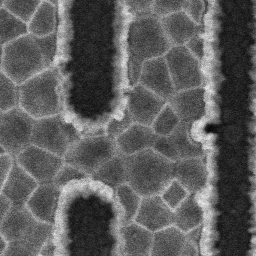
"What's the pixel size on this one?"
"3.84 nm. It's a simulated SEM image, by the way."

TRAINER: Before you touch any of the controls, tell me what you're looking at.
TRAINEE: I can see one or a few lines or trenches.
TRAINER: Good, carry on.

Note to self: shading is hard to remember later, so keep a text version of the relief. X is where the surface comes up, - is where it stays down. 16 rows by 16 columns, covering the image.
XXXX----XXXXXX--
XXXX----XXXXXX--
XXXX---XXXXXX---
XXXX---XXXXXXX--
XXXX---XXXXXX---
XXXX---XXXXXX---
XXXX---XXXXXX---
XXXXX--XXXXXX---
XXXXXXXXXXXXX---
XXXXXXXXXXXXX---
XXXXXXXXXXXXX---
XXXXXXXXXXXXX---
XXXX---XXXXXX---
XXXX---XXXXXX---
XXXX---XXXXXX---
XXXX---XXXXXX---